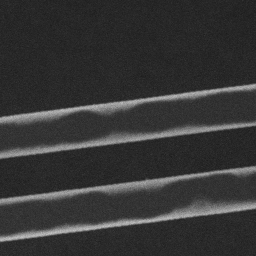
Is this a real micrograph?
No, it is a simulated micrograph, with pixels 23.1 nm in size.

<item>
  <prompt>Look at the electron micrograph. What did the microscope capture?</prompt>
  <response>lines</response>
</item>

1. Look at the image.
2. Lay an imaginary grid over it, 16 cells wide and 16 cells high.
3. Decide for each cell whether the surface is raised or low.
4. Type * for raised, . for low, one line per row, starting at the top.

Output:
................
................
................
................
................
..............**
.......*********
****************
**********......
***.............
................
........********
****************
***********.....
****............
................